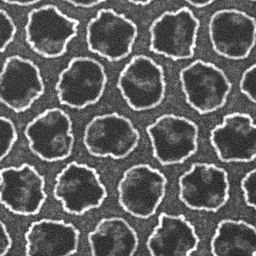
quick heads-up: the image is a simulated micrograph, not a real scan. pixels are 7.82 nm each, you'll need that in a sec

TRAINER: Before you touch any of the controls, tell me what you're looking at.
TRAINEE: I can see a regular array of raised bodies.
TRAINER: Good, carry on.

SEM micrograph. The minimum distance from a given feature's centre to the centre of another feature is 465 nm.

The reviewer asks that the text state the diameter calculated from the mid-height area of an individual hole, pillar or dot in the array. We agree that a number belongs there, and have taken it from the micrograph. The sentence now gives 372 nm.